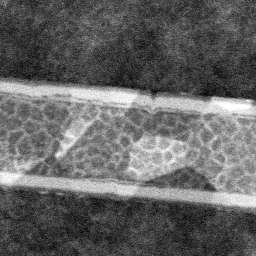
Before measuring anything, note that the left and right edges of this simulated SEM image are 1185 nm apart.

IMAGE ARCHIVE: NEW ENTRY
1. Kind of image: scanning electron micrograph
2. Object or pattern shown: one or a few lines or trenches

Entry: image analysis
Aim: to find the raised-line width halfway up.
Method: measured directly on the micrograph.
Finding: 412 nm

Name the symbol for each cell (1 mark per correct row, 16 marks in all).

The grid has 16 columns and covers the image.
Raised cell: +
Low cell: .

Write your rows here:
................
................
................
................
................
................
+++++++++++.....
++++++++++++++++
++++++++++++++++
++++++++++++++++
++++++++++++++++
....++++++++++++
...............+
................
................
................